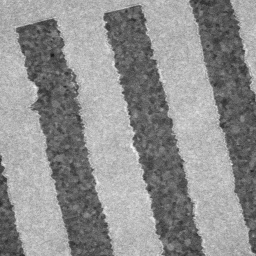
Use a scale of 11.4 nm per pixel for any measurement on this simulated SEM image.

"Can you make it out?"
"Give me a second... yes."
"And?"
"one or a few lines or trenches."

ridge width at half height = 477 nanometres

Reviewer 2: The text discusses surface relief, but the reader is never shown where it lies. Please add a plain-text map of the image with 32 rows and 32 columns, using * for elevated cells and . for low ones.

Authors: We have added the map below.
........................*****...
..............****......*****...
......*......*****..*...******..
..*****......*****.......*****..
..******.....******.*....*****..
..******.....******......*****..
...*****......*****......******.
...*****......*****......*******
...******.....******....********
...*********...*****....*.*****.
....********...*****......*****.
.....*****.....******......*****
....******......*****......*****
....******......*****......*****
.....*****......*****...*..*****
.....******.....******..*..*****
.....******...*..*****......****
......*****......*****......****
......*****......*****......****
......*****......******....*.***
......*****......******......***
*.*.*.******......*****......***
*...**.*****......*****......***
*......*****......******.....***
*......*****.......*****......**
**.....******......******.....**
**......*****......*****......**
**......*****......*****......**
**....*.******.....******......*
***.....******......*****......*
***......*****......*****......*
***......*****......*****......*